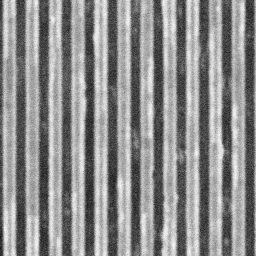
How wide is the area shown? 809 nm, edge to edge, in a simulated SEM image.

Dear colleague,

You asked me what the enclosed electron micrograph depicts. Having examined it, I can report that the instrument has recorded parallel lines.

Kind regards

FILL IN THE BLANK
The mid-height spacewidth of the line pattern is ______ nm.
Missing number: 39.2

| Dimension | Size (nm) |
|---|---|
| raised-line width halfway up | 33.6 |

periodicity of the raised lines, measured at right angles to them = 0.0725 um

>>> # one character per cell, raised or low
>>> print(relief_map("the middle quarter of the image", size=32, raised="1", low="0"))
00111000111000110000110001110001
00111000110000110000110001110001
00111000110000110000110001110001
00111000110000110000110001110001
00111000110000110000110001110001
00011000110000110000110001110001
00011000110000110000110001110001
00111000110000110000110001110001
00111000110000110000110001110001
00111000110000110000110001110001
00111000110000110000110001110001
00011000110000110000110001110001
00011000110000110000110001110001
00011000110000110000110001110001
00111000110000110000110001110001
00011000110000110000110001110001
00011000110000110000110001110001
00111000110000110000110001110001
00111000110000110000110001110001
00111000110000110000110001110001
00011000110000110000110001110001
00011000110000110000110001110001
00011000110000110000110001110001
00011000110000110000110001110001
00011000110000110000110001110001
00111000110000110000110001110001
00111000110000110000110001110001
00111000110000110000110001110001
00011000110000110000110001110001
00011000110001110000110001110001
00011000110001110000110001110001
00010000110000110000110001110001